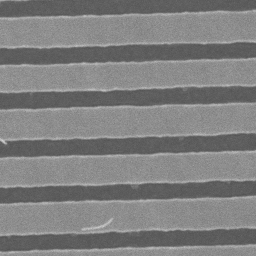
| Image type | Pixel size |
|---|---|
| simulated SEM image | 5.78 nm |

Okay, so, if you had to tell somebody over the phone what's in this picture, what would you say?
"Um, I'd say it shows lines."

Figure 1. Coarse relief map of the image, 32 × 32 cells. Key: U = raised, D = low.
DDDDDDDDDDDDDDDDDDDDDDDDDDDDDDDD
DDDDDDDDDDDDDDDDDDDDDDDDDDDUUDUU
UUUUUUUUUUUUUUUUUUUUUUUUUUUUUUUU
UUUUUUUUUUUUUUUUUUUUUUUUUUUUUUUU
UUUUUUUUUUUUUUUUUUUUUUUUUUUUUUUU
UUUUUUUUUUUUUUUUUDDDDDDDDDDDDDDD
DDDDDDDDDDDDDDDDDDDDDDDDDDDDDDDD
DDDDDDDDDDDDDDDDDDDDDDDDDUUUUUUU
UUUUUUUUUUUUUUUUUUUUUUUUUUUUUUUU
UUUUUUUUUUUUUUUUUUUUUUUUUUUUUUUU
UUUUUUUUUUUUUUUUUUUUUUUUUUUUUUUU
UUUUUDDDDDDDDDDDDDDDDDDDDDDDDDDD
DDDDDDDDDDDDDDDDDDDDDDDDDDDDDDDD
DDDDDDDDUUUUUUUUUUUUUUUUUUUUUUUU
UUUUUUUUUUUUUUUUUUUUUUUUUUUUUUUU
UUUUUUUUUUUUUUUUUUUUUUUUUUUUUUUU
UUUUUUUUUUUUUUUUUUUUUUUUUUUUUUUU
UUUDDDDDDDDDDDDDDDDDDDDDDDDDDDDD
DDDDDDDDDDDDDDDDDDDDDDDDDDDDDDDD
DDDDDDDUUUUUUUUUUUUUUUUUUUUUUUUU
UUUUUUUUUUUUUUUUUUUUUUUUUUUUUUUU
UUUUUUUUUUUUUUUUUUUUUUUUUUUUUUUU
UUUUUUUUUUUUUUUUUUUUUUUUUUUUUUUU
DDDDDDDDDDDDDDDDDDDDDDDDDDDDDDDD
DDDDDDDDDDDDDDDDDDDDDDDDDDDDDDDD
DUUUUUUUUUUUUUUUUUUUUUUUUUUUUUUU
UUUUUUUUUUUUUUUUUUUUUUUUUUUUUUUU
UUUUUUUUUUUUUUUUUUUUUUUUUUUUUUUU
UUUUUUUUUUUUUUUUUUUUUUUUUUUUUUDU
DDDDDDDDDDDDDDDDDDDDDDDDDDDDDDDD
DDDDDDDDDDDDDDDDDDDDDDDDDDDDDDDD
UUUUUUUUUUUUUUUUUUUUUUUUUUUUUUUU